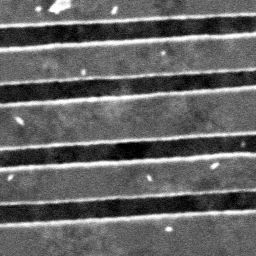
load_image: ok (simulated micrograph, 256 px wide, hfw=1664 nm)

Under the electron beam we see lines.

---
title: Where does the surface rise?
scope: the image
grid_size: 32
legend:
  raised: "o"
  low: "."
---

oooooooooooooooooooooooooooooooo
oooooooooooooooooooooooooooooooo
ooooooooooooooooo...............
................................
........................oooooooo
........oooooooooooooooooooooooo
oooooooooooooooooooooooooooooooo
oooooooooooooooooooooooooooooooo
oooooooooooooooooooooooooooooooo
oooooooooooooooooo..............
o...............................
.......................ooooooooo
........oooooooooooooooooooooooo
oooooooooooooooooooooooooooooooo
oooooooooooooooooooooooooooooooo
oooooooooooooooooooooooooooooooo
oooooooooooooooooooooooooooooooo
ooooooooooooooooooo.............
ooo.............................
..........................oooooo
.........ooooooooooooooooooooooo
oooooooooooooooooooooooooooooooo
oooooooooooooooooooooooooooooooo
oooooooooooooooooooooooooooooooo
ooooooooooooooooooooo...........
................................
............................oooo
...........ooooooooooooooooooooo
oooooooooooooooooooooooooooooooo
oooooooooooooooooooooooooooooooo
oooooooooooooooooooooooooooooooo
oooooooooooooooooooooooooooooooo